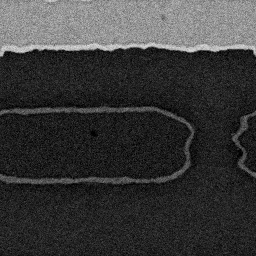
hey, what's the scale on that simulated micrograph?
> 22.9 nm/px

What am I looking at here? one or a few lines or trenches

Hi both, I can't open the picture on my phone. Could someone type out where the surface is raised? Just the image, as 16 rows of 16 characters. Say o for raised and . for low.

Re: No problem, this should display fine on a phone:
oooooooooooooooo
oooooooooooooooo
oooooooooooooooo
................
................
................
................
ooooooooooo....o
oooooooooooo...o
oooooooooooo...o
oooooooooooo...o
................
................
................
................
................